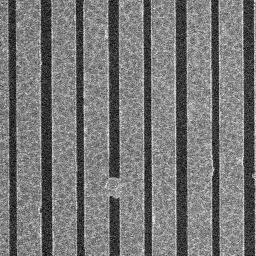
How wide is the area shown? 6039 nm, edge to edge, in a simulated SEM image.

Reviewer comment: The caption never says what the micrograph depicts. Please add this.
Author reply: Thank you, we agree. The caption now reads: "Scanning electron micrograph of parallel lines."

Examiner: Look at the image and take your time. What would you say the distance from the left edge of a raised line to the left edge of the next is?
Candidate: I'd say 796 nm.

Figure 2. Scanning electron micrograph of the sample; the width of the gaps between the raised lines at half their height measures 209 nm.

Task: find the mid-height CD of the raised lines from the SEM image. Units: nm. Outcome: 563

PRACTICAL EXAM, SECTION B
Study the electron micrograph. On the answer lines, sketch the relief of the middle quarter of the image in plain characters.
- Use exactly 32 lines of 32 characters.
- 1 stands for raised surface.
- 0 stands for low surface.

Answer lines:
11100111111000111111001111110001
11100111111000111111001111110001
11100111111000111111001111110001
11100111111000111111001111110001
11100111111000111111001111110001
11100111111000111111001111110001
11100111111000111111001111110001
11100111111000111111001111110001
11100111111000111111001111110001
11100111111000111111001111110001
11100111111000111111001111110000
11100111111000111111001111110001
11100111111000111111001111110001
11100111111000111111001111110001
11100111111000111111001111110001
11100111111000111111001111110001
11100111111000111111001111110001
11100111111000111111001111110001
11100111111000111111001111110001
11100111111000111111001111110001
11100111111000111111001111110001
11100111111000111111001111110001
11100111111000111111001111110001
11100111111000111111001111110001
11100111111000111111001111110001
11100111111000111111001111110001
11100111101000111111001111110001
11100111101000111111001111110001
11100111111100111111001111110001
01100111111111111111001111110001
11100111111111111111001111110001
11100111111111111111001111110001